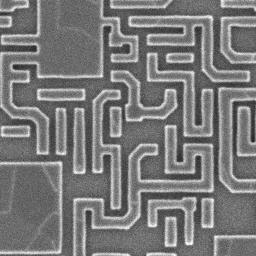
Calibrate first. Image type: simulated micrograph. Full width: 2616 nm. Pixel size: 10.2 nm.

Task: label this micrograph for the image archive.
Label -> wiring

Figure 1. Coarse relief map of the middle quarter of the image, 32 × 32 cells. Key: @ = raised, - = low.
@@@@@@@@@@-----------@@---------
@@@@@@@@@@-----------@@---------
@@@@@@@@@@--@@@@@----@@@@@@@@@@@
------------@@@@@@---@@@@@@@@@@@
---------------@@@@-----------@@
----------------@@@-----------@@
@@@@@-----------@@@-------@@--@@
@@@@@----@@@@@--@@@------@@@--@@
@@@@@---@@@@@@--@@@------@@@--@@
-------@@@------@@@------@@@--@@
-------@@@-----@@@@-----@@@@--@@
---@@--@@@--@@-@@@@@@@@@@@@---@@
---@@--@@@--@@-@@@@@@@@@@@----@@
---@@--@@---@@--@@@@----@-----@@
---@@--@@---@@----------------@@
---@@--@@---@@----------------@@
---@@--@@---@@------------@@--@@
---@@--@@---@@------------@@--@@
---@@--@@-----------------@@----
---@@--@@-----------------@@----
---@@--@@@@@@@-----@@@@---@@--@@
---@@--@@@@@@@----@@@@@---@@--@@
---@@--@@@-@@@---@@@@@@---@@--@@
---@@--@@@--@@--@@@-------@@--@@
---@@--@@@--@@--@@@-------@@--@@
---@@--@@@--@@--@@@-------@@@@@@
---@@--@@@--@@--@@@-------@@@@@@
------------@@--@@@-------------
------------@@--@@@-------------
------------@@--@@@@@@@@@@@@@@@@
------------@@--@@@@@@@@@@@@@@@@
------------@@--@@@@@@@@@@@@@@@@